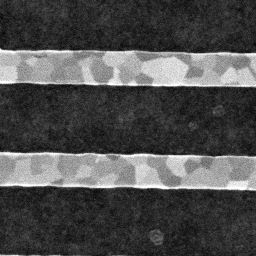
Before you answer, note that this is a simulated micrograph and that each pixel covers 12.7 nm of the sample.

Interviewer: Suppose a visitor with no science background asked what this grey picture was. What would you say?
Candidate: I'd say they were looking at wiring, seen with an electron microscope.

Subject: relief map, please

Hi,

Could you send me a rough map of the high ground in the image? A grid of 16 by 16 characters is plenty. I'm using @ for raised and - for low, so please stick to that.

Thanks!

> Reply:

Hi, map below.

----------------
----------------
----------------
@@@@@@@@@@@@@@@@
@@@@@@@@@@@@@@@@
----------------
----------------
----------------
----------------
----------------
@@@@@@@@@@@@@@@@
@@@@@@@@@@@@@@@@
----------------
----------------
----------------
----------------